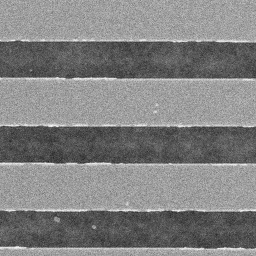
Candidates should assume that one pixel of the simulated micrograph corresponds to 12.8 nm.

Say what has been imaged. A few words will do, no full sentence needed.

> lines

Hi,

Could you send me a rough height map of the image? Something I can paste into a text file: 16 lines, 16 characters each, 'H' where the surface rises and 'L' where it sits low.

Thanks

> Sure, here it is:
HHHHHHHHHHHHHHHH
HHHHHHHHHHHHHHHH
HHHHHHHHHHHHHHHH
LLLLLLLLLLLLLLLL
LLLLLLLLLLLLLLLL
HHHHHHHHHHHHHHHH
HHHHHHHHHHHHHHHH
HHHHHHHHHHHHHHHH
LLLLLLLLLLLLLLLL
LLLLLLLLLLLLLLLL
HHHHHHHHHHHHHHHH
HHHHHHHHHHHHHHHH
HHHHHHHHHHHHHHHH
LLLLLLLLLLLLLLLL
LLLLLLLLLLLLLLLL
HHLLLLLLLLLLLLLL